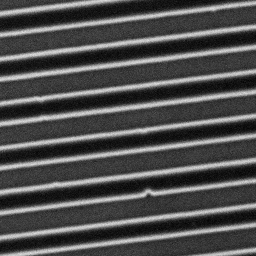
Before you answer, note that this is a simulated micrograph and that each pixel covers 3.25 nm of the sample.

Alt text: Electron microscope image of parallel lines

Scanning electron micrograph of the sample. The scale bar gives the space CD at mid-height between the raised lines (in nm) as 76.2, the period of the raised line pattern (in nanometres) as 144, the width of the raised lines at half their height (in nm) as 67.3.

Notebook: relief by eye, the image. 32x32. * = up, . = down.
.........***********************
.***********************........
****************................
********......................**
......................**********
...............*****************
......**********************....
********************............
************....................
****.......................*****
...................*************
...........*********************
...**********************.......
*****************...............
*********......................*
*......................*********
................****************
........********************....
********************............
************....................
****........................****
....................************
............********************
....**********************......
******************..............
**********......................
**.......................*******
.................***************
..........*******************...
..********************..........
*************...................
*****........................***